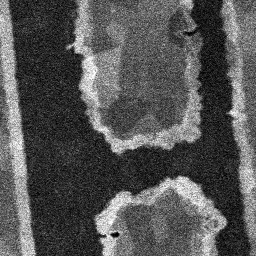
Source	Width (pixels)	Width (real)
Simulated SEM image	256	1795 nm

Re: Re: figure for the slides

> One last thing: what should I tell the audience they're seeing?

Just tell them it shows one or a few lines or trenches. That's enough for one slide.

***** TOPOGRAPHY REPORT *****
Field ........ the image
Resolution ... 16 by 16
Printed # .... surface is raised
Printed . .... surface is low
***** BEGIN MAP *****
.....#######..##
.....#######..##
.....#######..##
.....#######...#
#.....######...#
#....#######...#
#.....######...#
#.....######...#
#......###.....#
#..............#
#..............#
#.........#....#
#........###....
##.....#######..
##....########..
##.....######...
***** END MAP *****